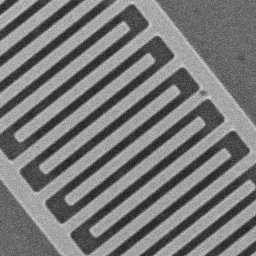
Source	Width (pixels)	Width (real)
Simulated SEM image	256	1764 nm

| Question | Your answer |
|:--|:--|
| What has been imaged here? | groups of lines, slits or small figures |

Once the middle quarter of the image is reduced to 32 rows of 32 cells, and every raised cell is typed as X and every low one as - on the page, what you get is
-XXXX----XXXX----XXXX----XXXXXXX
XXXX----XXXX----XXXX----XXXX---X
XX----XXXXX----XXXX---XXXXX-----
X----XXXX----XXXX----XXXXX------
----XXXX----XXXX----XXXX--------
---XXXX----XXXX----XXXX----X----
-XXXXX---XXXXX---XXXXX----XXX---
XXXX----XXXXX---XXXXX---XXXXX---
XXX----XXXX----XXXX----XXXX----X
XX----XXXX----XXXX----XXXX----XX
X---XXXXX----XXXX----XXXX----XXX
---XXXXX---XXXXX---XXXXX----XXXX
--XXXX----XXXX----XXXX----XXXXX-
-XXXX----XXXX----XXXX----XXXX---
XXXX----XXXX----XXXX----XXXX----
XXX---XXXXX----XXXX----XXXX----X
X----XXXX----XXXX----XXXXX----XX
----XXXX----XXXX----XXXX----XXXX
---XXXX----XXXX----XXXX----XXXX-
-XXXXX----XXXX----XXXX----XXXX--
XXXX----XXXXX---XXXXX----XXXX---
XXX----XXXX----XXXX----XXXXX---X
XX----XXXX----XXXX----XXXX----XX
----XXXXX----XXXX----XXXX----XXX
---XXXX----XXXXX---XXXX----XXXXX
--XXXX----XXXX----XXXX----XXXX--
XXXXX----XXXX----XXXX----XXXX---
XXXX---XXXXX----XXXX----XXXX----
XX----XXXXX---XXXX----XXXXX----X
X----XXXX----XXXX----XXXX----XXX
----XXXX----XXXX----XXXX----XXXX
--XXXXX----XXXX----XXXX----XXXX-